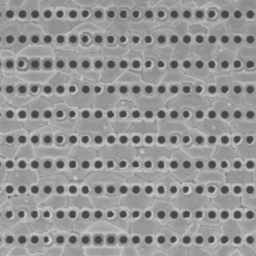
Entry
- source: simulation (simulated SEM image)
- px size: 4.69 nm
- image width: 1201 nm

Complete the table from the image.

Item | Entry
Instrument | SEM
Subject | a regular array of holes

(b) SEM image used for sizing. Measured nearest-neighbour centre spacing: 12.4 pixels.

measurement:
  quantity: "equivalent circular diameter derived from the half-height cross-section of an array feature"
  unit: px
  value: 7.4